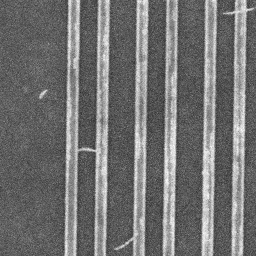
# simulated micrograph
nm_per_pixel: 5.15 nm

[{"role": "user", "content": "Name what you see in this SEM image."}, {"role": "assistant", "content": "parallel lines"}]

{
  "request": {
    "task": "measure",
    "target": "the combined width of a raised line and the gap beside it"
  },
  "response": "0.172 micrometres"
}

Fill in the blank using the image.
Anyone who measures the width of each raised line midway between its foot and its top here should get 41.9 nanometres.